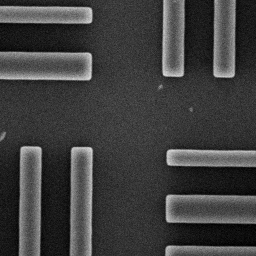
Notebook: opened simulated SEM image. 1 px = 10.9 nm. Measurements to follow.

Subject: groups of lines, slits or small figures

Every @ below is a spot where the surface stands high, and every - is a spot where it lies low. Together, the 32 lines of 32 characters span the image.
---------------------@@----@@---
@@@@@@@@@@@----------@@----@@---
@@@@@@@@@@@----------@@----@@---
---------------------@@----@@---
--------------------@@@----@@---
--------------------@@@----@@---
--------------------@@@----@@---
@@@@@@@@@@@---------@@@----@@---
@@@@@@@@@@@---------@@@----@@---
@@@@@@@@@@@----------@@----@@---
--------------------------------
--------------------------------
--------------------------------
--------------------------------
--------------------------------
--------------------------------
--------------------------------
--------------------------------
---@@---------------------------
---@@----@@@---------@@@@@@@@@@@
---@@----@@@---------@@@@@@@@@@@
---@@----@@---------------------
---@@----@@---------------------
---@@----@@---------------------
---@@----@@----------@----------
---@@----@@----------@@@@@@@@@@@
---@@----@@----------@@@@@@@@@@@
---@@----@@----------@@@@@@@@@@@
---@@----@@---------------------
---@@----@@---------------------
---@@----@@---------------------
--@@@----@@----------@@@@@@@@@@@